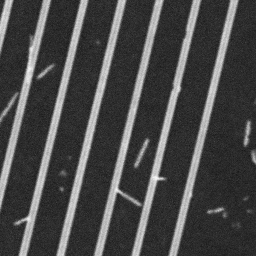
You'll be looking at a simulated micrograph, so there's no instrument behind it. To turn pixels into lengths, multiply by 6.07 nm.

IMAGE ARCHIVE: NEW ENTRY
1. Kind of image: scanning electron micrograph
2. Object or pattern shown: parallel lines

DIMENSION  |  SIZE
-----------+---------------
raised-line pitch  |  222 nm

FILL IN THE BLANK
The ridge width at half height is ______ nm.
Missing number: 40.5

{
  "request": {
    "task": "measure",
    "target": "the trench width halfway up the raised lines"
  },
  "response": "0.185 microns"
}